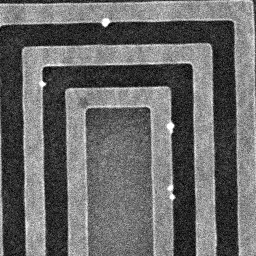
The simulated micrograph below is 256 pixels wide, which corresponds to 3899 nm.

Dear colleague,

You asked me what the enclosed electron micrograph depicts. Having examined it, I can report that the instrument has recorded groups of lines, slits or small figures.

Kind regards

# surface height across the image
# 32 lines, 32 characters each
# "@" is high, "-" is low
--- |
-----------@@@@@@@@@@@@@@@@@@@@@
@@@@@@@@@@@@@@@@@@@@@@@@@@@@@@@@
@@@@@@@@@@@@@@@@@@@@@@@@@@@@@@@@
-----------------------------@@@
-----------------------------@@@
-----------------------------@@@
---@@@@@@@@@@@@@@@@@@@@@@@---@@@
---@@@@@@@@@@@@@@@@@@@@@@@---@@@
---@@-------------------@@---@@@
---@@-------------------@@---@@@
---@@-------------------@@----@@
---@@---@@@@@@@@@@@@@---@@@---@@
---@@---@@@@@@@@@@@@@---@@@---@@
---@@---@@@--------@@---@@@---@@
---@@---@@@--------@@---@@@---@@
---@@---@@@--------@@@--@@@---@@
---@@---@@@--------@@---@@@---@@
---@@---@@@--------@@---@@@---@@
---@@---@@@--------@@---@@@---@@
---@@---@@@--------@@---@@@---@@
---@@---@@@--------@@---@@@---@@
---@@---@@@--------@@---@@@---@@
---@@---@@@--------@@---@@@---@@
---@@---@@@--------@@@--@@@---@@
---@@----@@--------@@@--@@@---@@
---@@@---@@--------@@@---@@---@@
---@@@---@@--------@@@---@@---@@
---@@@---@@--------@@@---@@---@@
---@@@---@@--------@@@---@@---@@
---@@@---@@--------@@@---@@---@@
---@@@---@@--------@@@---@@---@@
---@@@---@@--------@@@---@@---@@